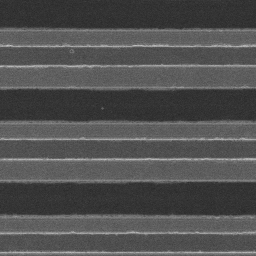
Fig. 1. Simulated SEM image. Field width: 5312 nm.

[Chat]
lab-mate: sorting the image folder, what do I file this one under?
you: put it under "lines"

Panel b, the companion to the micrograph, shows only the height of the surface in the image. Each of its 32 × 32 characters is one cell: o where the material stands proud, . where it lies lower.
................................
................................
................................
................................
oooooooooooooooooooooooooooooooo
oooooooooooooooooooooooooooooooo
oooooooooooooooooooooooooooooooo
oooooooooooooooooooooooooooooooo
oooooooooooooooooooooooooooooooo
oooooooooooooooooooooooooooooooo
oooooooooooooooooooooooooooooooo
................................
................................
................................
................................
oooooooooooooooooooooooooooooooo
oooooooooooooooooooooooooooooooo
oooooooooooooooooooooooooooooooo
oooooooooooooooooooooooooooooooo
oooooooooooooooooooooooooooooooo
oooooooooooooooooooooooooooooooo
oooooooooooooooooooooooooooooooo
oooooooooooooooooooooooooooooooo
................................
................................
................................
................................
oooooooooooooooooooooooooooooooo
oooooooooooooooooooooooooooooooo
oooooooooooooooooooooooooooooooo
oooooooooooooooooooooooooooooooo
oooooooooooooooooooooooooooooooo